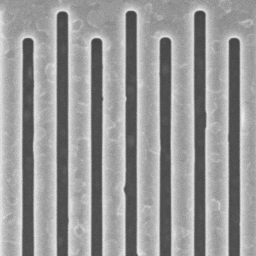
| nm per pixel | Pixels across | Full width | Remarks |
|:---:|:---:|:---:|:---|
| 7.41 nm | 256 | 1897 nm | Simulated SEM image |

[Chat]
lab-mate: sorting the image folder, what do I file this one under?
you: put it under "parallel lines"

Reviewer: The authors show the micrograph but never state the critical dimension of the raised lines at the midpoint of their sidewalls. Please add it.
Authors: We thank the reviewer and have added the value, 169 nm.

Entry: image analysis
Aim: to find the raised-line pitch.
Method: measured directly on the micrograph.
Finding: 255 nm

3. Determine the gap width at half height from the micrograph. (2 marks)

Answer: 87.1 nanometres